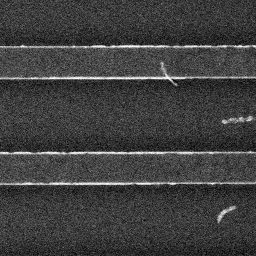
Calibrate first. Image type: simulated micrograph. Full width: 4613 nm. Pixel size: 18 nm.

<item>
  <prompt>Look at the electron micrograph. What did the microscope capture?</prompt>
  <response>lines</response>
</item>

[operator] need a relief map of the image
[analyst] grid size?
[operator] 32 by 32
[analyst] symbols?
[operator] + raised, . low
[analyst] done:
................................
................................
................................
................................
................................
................................
++++++++++++++++++++++++++++++++
++++++++++++++++++++++++++++++++
++++++++++++++++++++++++++++++++
++++++++++++++++++++++++++++++++
................................
................................
................................
................................
................................
................................
................................
................................
................................
++++++++++++++++++++++++++++++++
++++++++++++++++++++++++++++++++
++++++++++++++++++++++++++++++++
++++++++++++++++++++++++++++++++
................................
................................
................................
................................
................................
................................
................................
................................
................................